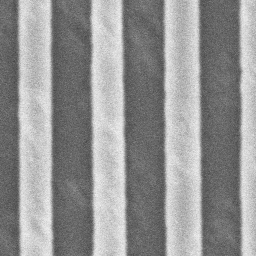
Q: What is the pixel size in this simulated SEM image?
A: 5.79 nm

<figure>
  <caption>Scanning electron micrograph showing lines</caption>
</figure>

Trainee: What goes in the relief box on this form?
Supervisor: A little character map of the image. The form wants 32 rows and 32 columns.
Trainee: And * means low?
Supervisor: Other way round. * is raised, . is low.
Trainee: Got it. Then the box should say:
..****......***......****.....**
..****......***......****.....**
..****......***......****.....**
..****......***......****.....**
..****......***......****.....**
..****......***......****.....**
...***......***......****.....**
...***......***......****.....**
...***......***......****.....**
...***......***......****.....**
..****......***......****.....**
..****......***......****.....**
...***......***......****.....**
..****......***......****.....**
..****......***......****.....**
...***......***......****.....**
...***......***......****.....**
...***......***......****.....**
...***......***......****.....**
...***......***......****.....**
...***......***......****.....**
...***......***......****.....**
...***......***......****.....**
...***......***......****.....**
...***......****.....****.....**
...***......****.....****.....**
...***......***......****.....**
...***......****.....****.....**
...***......****.....****.....**
...***......****.....****.....**
...***......****.....****.....**
...***......****.....****.....**